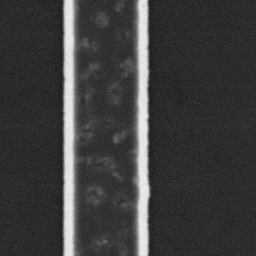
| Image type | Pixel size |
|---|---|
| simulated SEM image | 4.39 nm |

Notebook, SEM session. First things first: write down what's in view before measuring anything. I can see one or a few lines or trenches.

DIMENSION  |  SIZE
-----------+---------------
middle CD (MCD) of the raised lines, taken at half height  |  330 nm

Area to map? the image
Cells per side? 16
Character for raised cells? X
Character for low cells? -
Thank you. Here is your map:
----XXXXX-------
----XXXXX-------
----XXXXX-------
----XXXXX-------
----XXXXX-------
----XXXXX-------
----XXXXX-------
----XXXXX-------
----XXXXX-------
----XXXXX-------
----XXXXX-------
----XXXXX-------
----XXXXX-------
----XXXXX-------
----XXXXX-------
----XXXXX-------